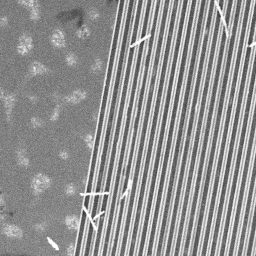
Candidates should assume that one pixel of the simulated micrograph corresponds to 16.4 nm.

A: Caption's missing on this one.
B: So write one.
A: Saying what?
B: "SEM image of parallel lines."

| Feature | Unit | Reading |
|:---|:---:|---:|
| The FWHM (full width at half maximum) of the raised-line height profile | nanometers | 60.4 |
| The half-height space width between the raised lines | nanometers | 90.6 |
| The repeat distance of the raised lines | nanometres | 145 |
